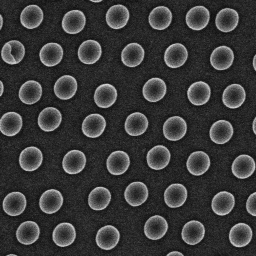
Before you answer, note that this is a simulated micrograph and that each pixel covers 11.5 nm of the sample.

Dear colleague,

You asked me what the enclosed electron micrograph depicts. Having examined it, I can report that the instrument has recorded a regular array of raised bodies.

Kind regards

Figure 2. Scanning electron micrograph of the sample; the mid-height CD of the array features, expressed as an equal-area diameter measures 266 nm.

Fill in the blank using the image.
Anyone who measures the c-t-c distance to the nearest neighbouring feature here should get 417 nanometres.